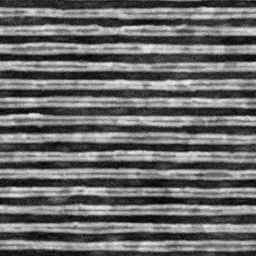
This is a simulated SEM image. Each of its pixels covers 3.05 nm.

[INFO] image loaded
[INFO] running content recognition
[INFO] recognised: parallel lines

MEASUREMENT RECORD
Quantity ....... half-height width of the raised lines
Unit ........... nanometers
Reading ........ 20.6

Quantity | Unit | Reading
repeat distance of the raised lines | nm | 54.6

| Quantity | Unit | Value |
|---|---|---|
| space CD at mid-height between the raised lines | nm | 32.8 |